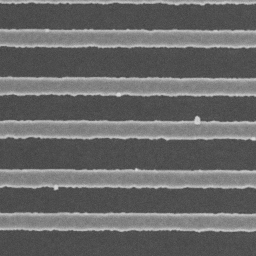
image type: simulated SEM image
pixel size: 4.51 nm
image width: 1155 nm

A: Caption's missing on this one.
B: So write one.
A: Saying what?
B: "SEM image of lines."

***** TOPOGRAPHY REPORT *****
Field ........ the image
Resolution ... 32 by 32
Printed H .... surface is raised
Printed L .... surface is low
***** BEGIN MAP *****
LLLLLLLLLLLLLLLLLLLLLHHLLHLLLLLL
LLLLLLLLLLLLLLLLLLLLLLLLLLLLLLLL
LLLLLLLLLLLLLLLLLLLLLLLLLLLLLLLL
LLLLLLLLLLLLLLLLLLLLLLLLLLLLLLLL
HHHHHHHHHHHHHHHHHHHHHHHHHHHHHHHH
HHHHHHHHHHHHHHHHHHHHHHHHHHHHHHHH
LLLLLLLLLLLLLLLLLLLLLLLLLLLLLLLL
LLLLLLLLLLLLLLLLLLLLLLLLLLLLLLLL
LLLLLLLLLLLLLLLLLLLLLLLLLLLLLLLL
LLLLLLLLLLLLLLLLLLLLLLLLLLLLLLLL
HHHHHHHHHHHHHHHHHHHHHHHHHHHHHHHH
HHHHHHHHHHHHHHHHHHHHHHHHHHHHHHHH
LLLLLLLLLLLLLLLLLLLLLLLLLLLLLLLL
LLLLLLLLLLLLLLLLLLLLLLLLLLLLLLLL
LLLLLLLLLLLLLLLLLLLLLLLLLLLLLLLL
HHHHHHHHHHHHHHHHHHHHHHHHHHHHHHHH
HHHHHHHHHHHHHHHHHHHHHHHHHHHHHHHH
LLLLLLLLLLLLLLLLLLLLLLLLLLLLLLLH
LLLLLLLLLLLLLLLLLLLLLLLLLLLLLLLL
LLLLLLLLLLLLLLLLLLLLLLLLLLLLLLLL
LLLLLLLLLLLLLLLLLLLLLLLLLLLLLLLL
HHHHHHHHHHHHHHHHHHHHHHHHHHHHHHHH
HHHHHHHHHHHHHHHHHHHHHHHHHHHHHHHH
LLLLHLLLLLLLLLLLLLLHLHHLLHLHHHHL
LLLLLLLLLLLLLLLLLLLLLLLLLLLLLLLL
LLLLLLLLLLLLLLLLLLLLLLLLLLLLLLLL
LLLLLLLLLLLLLLLLLLLLLLLLLLLLLLLL
HHHHHHHHHHHHHHHHHHHHHHHHHHHHHHHH
HHHHHHHHHHHHHHHHHHHHHHHHHHHHHHHH
LLLLLLLLLLLLLLLLLLLLLLLLLLLLLLLL
LLLLLLLLLLLLLLLLLLLLLLLLLLLLLLLL
LLLLLLLLLLLLLLLLLLLLLLLLLLLLLLLL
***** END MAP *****